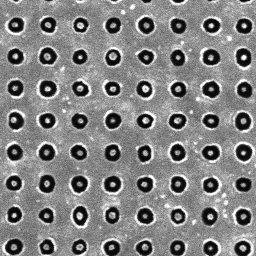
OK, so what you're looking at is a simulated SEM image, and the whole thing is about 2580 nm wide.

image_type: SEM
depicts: a regular array of ring-shaped grooves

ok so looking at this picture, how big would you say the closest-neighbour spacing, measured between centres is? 31.4 px